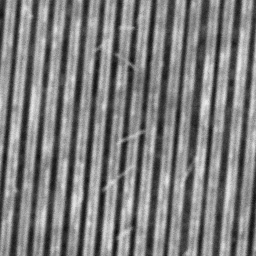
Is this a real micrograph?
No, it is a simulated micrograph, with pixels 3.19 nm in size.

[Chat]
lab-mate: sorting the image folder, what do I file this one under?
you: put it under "parallel lines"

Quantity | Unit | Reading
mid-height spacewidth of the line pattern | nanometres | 28.6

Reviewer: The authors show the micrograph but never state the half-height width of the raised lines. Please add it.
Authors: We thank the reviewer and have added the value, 25.8 nm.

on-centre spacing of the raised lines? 53.8 nanometres